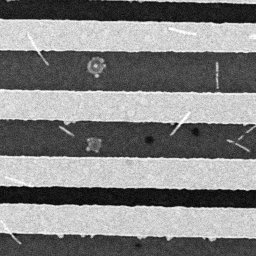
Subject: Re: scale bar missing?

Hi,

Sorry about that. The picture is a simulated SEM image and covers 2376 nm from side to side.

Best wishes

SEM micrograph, lines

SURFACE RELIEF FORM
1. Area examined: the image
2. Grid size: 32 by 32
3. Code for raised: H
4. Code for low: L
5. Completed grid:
LLLLLLLLLLLLLLLLLLLLLLLLLLLLLLLL
LLLLLLLLLLLLLLLLLLLLLLLLLLLLLLLL
HLLLLLLLLLLLLLLLLLLLLLLLLLLLLLLL
HHHHHHHHHHHHHHHHHHHHHHHHHHHHHHHH
HHHHHHHHHHHHHHHHHHHHHHHHHHHHHHHH
HHHHHHHHHHHHHHHHHHHHHHHHHHHHHHHH
LLLLLLLLLLLLLLLLLLLLLLLLLLLLLLHL
LLLLLLLLLLLLLLLLLLLLLLLLLLLLLLLL
LLLLLLLLLLLLLLLLLLLLLLLLLLLLLLLL
LLLLLLLLLLLLLLLLLLLLLLLLLLLLLLLL
LLLLLLLLLLLLLLLLLLLLLLLLLLLLLLLL
HHHHHHHHHHHHHHHHHHHHHLLLLLLLLLLL
HHHHHHHHHHHHHHHHHHHHHHHHHHHHHHHH
HHHHHHHHHHHHHHHHHHHHHHHHHHHHHHHH
HHHHHHHHHHHHHHHHHHHHHHHHHHHHHHHH
LLLLLLLLLLLLLLLLLLLLLLLLLLLLLLLL
LLLLLLLLLLLLLLLLLLLLLLLLLLLLLLLL
LLLLLLLLLLLLLLLLLLLLLLLLLLLLLLLL
LLLLLLLLLLLLLLLLLLLLLLLLLLLLLLLL
HLLLLLLLLLLLLLLLLLLLLLLLLLLLLLLL
HHHHHHHHHHHHHHHHHHHHHHHHHHHHHHHH
HHHHHHHHHHHHHHHHHHHHHHHHHHHHHHHH
HHHHHHHHHHHHHHHHHHHHHHHHHHHHHHHH
LLLLLLLLLLLLLLLHLLLHHHHHHHHHHHHH
LLLLLLLLLLLLLLLLLLLLLLLLLLLLLLLL
LLLLLLLLLLLLLLLLLLLLLLLLLLLLLLLL
HHHHHHHHHHHHHHHHHHHHHHHHHHHHHHHH
HHHHHHHHHHHHHHHHHHHHHHHHHHHHHHHH
HHHHHHHHHHHHHHHHHHHHHHHHHHHHHHHH
LLLLLLLLLLLLLLLLLLLHHHHHHHHHHHHH
LLLLLLLLLLLLLLLLLLLLLLLLLLLLLLLL
LLLLLLLLLLLLLLLLLLLLLLLLLLLLLLLL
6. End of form